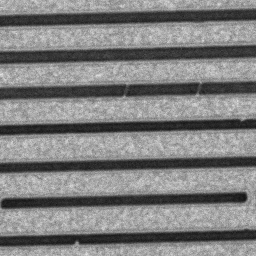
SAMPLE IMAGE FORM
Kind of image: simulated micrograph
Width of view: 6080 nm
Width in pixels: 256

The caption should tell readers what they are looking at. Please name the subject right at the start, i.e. parallel lines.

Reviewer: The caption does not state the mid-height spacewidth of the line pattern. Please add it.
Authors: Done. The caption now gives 273 nanometers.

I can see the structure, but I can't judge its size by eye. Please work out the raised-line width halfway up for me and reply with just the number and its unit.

0.591 microns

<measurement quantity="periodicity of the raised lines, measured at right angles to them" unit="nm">871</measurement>